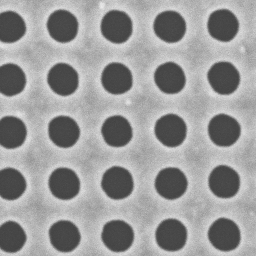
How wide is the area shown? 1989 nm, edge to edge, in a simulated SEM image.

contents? a regular array of holes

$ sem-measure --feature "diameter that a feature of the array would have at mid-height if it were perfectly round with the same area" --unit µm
0.26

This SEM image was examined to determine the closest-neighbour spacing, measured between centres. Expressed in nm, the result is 405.